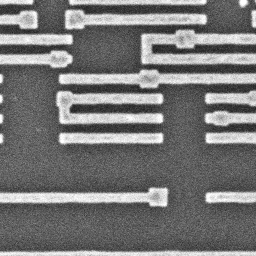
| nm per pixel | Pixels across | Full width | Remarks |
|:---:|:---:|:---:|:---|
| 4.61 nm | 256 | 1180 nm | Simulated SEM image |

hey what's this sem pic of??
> wiring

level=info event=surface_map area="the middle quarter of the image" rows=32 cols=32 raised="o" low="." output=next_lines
................................
................................
...................ooooo........
oooooooooooooooooooooooooooooooo
oooooooooooooooooooooooooooooooo
...................oooo.........
................................
oo..............................
ooooooooooooooooooooooooo.......
ooooooooooooooooooooooooo.......
oo..............................
o...............................
oo..............................
ooooooooooooooooooooooooo.......
oooooooooooooooooooooooo........
................................
................................
................................
oooooooooo.oooooooooooooo.......
oooooooooooooooooooooooo........
................................
................................
................................
................................
................................
................................
................................
................................
................................
................................
................................
.....................ooooo......